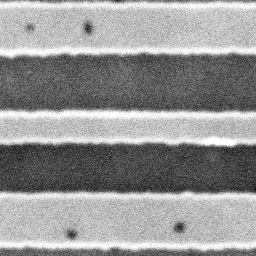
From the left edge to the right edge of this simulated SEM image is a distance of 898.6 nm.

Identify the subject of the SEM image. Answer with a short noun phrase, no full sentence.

lines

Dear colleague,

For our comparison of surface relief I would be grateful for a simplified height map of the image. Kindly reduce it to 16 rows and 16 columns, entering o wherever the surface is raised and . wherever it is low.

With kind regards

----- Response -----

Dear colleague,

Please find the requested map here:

oooooooooooooooo
oooooooooooooooo
oooooooooooooooo
................
................
................
................
oooooooooooooooo
oooooooooooooooo
................
................
................
oooooooooooooooo
oooooooooooooooo
oooooooooooooooo
................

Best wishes